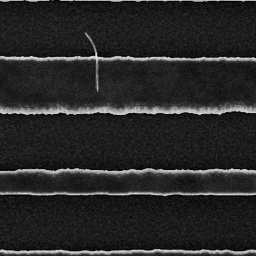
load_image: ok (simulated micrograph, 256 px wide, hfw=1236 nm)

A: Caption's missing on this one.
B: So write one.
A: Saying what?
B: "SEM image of lines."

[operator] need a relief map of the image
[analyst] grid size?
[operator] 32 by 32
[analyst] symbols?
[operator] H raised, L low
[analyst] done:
LLLLLLLLLLLLLLLLLLLLLLLLLLLLLLLL
LLLLLLLLLLLLLLLLLLLLLLLLLLLLLLLL
LLLLLLLLLLLLLLLLLLLLLLLLLLLLLLLL
LLLLLLLLLLLLLLLLLLLLLLLLLLLLLLLL
LLLLLLLLLLLLLLLLLLLLLLLLLLLLLLLL
LLLLLLLLLLLLLLLLLLLLLLLLLLLLLLLL
LLLLLLLLLLLLLLLLLLLLLLLLLLLLLLLL
HHHHHHHHHHHHHHHHHHHHHHHHHHHHHHHH
HHHHHHHHHHHHHHHHHHHHHHHHHHHHHHHH
HHHHHHHHHHHHHHHHHHHHHHHHHHHHHHHH
HHHHHHHHHHHHHHHHHHHHHHHHHHHHHHHH
HHHHHHHHHHHHHHHHHHHHHHHHHHHHHHHH
HHHHHHHHHHHHHHHHHHHHHHHHHHHHHHHH
HHHHHHHHHHHHHHHHHHHHHHHHHHHHHHHH
LLLLLLLLLLLLLLLLLLLLLLLLLLLLLLLL
LLLLLLLLLLLLLLLLLLLLLLLLLLLLLLLL
LLLLLLLLLLLLLLLLLLLLLLLLLLLLLLLL
LLLLLLLLLLLLLLLLLLLLLLLLLLLLLLLL
LLLLLLLLLLLLLLLLLLLLLLLLLLLLLLLL
LLLLLLLLLLLLLLLLLLLLLLLLLLLLLLLL
LLLLLLLLLLLLLLLLLLLLLLLLLLLLLLLL
HHHHHHHHHHHHHHHHHHHHHHHHHHHHHHHH
HHHHHHHHHHHHHHHHHHHHHHHHHHHHHHHH
HHHHHHHHHHHHHHHHHHHHHHHHHHHHHHHH
LLLLLLLLLLLLLLLLLLLLLLLLLLLLLLLL
LLLLLLLLLLLLLLLLLLLLLLLLLLLLLLLL
LLLLLLLLLLLLLLLLLLLLLLLLLLLLLLLL
LLLLLLLLLLLLLLLLLLLLLLLLLLLLLLLL
LLLLLLLLLLLLLLLLLLLLLLLLLLLLLLLL
LLLLLLLLLLLLLLLLLLLLLLLLLLLLLLLL
LLLLLLLLLLLLLLLLLLLLLLLLLLLLLLLL
HHHHHHHHHHHHHHHHHHHHHHHHHHHHHHHH